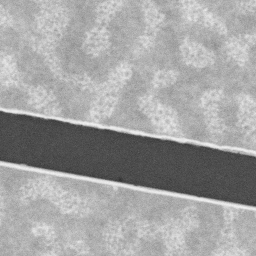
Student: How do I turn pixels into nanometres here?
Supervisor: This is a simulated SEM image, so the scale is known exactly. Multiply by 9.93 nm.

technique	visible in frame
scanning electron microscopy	one or a few lines or trenches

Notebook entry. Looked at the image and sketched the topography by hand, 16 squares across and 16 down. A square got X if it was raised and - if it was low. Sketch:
XXXXXXXXXXXXXXXX
XXXXXXXXXXXXXXXX
XXXXXXXXXXXXXXXX
XXXXXXXXXXXXXXXX
XXXXXXXXXXXXXXXX
XXXXXXXXXXXXXXXX
XXXXXXXXXXXXXXXX
----XXXXXXXXXXXX
----------XXXXXX
----------------
X---------------
XXXXXXX---------
XXXXXXXXXXXXX---
XXXXXXXXXXXXXXXX
XXXXXXXXXXXXXXXX
XXXXXXXXXXXXXXXX